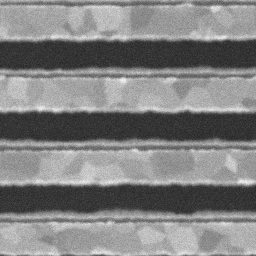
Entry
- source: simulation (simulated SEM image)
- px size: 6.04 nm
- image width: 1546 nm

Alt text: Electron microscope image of lines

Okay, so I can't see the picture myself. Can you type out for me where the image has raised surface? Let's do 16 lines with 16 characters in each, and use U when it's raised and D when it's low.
UUUUUUUUUUUUUUUU
UUUUUUUUUUUUUUUU
DDDDDDDDDDDDDDDD
DDDDDDDDDDDDDDDD
UDDUUUUUDDUUUUDU
UUUUUUUUUUUUUUUU
UUUUUUUUUUUUUUUU
DDDDDDDDDDDDDDDD
DDDDDDDDDDDDDDDD
UUUUUUUUUUUUUUUU
UUUUUUUUUUUUUUUU
DDDDDDDDDDDDDDDD
DDDDDDDDDDDDDDDD
DDDUDDUUUDDDUUUU
UUUUUUUUUUUUUUUU
UUUUUUUUUUUUUUUU